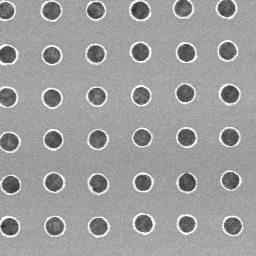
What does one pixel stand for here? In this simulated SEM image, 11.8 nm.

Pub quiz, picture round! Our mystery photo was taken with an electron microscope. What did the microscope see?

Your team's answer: a regular array of holes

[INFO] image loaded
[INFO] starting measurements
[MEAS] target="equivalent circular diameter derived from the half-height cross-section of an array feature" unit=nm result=220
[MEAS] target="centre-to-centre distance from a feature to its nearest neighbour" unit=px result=42.4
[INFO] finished